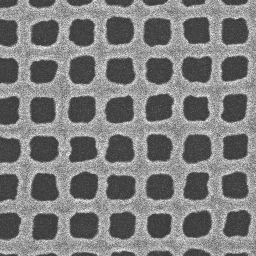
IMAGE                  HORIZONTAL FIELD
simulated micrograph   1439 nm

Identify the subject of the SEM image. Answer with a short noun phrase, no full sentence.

a regular array of holes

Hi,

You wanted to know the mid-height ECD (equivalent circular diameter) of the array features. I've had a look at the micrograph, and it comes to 158 nanometres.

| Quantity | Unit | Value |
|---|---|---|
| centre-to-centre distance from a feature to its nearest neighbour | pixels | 37.5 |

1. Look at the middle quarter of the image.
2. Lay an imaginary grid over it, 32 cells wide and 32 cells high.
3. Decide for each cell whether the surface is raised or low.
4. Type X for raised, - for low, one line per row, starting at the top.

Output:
XX------XXX------XXXX------XX---
X-------XXX-------XXX------XX---
X-------XXX-------XX-------XX---
XX-----XXXX-------XXX------XXX--
XX-----XXXXX-----XXXXX----XXXXXX
XXXXXXXXXXXXXXXXXXXXXXXXXXXXXXXX
XXXXXXXXXXXXXXXXXXXXXXXXXXXXXXXX
XXXXXXXXXXXXXXXXXXXXXXXX--XXXXXX
XX-----XXXXX-----XXXX------XXX--
X-------XXX------XXXX------XXX--
X-------XX-------XXX-------XXX--
X-------XX-------XXX-------XXX--
X-------XX-------XXX-------XXX--
X------XXX-------XXX------XXXX--
XX----XXXXX----XXXXXXXXXXXXXXXXX
XXXXXXXXXXXXXXXXXXXXXXXXXXXXXXXX
XXXXXXXXXXXXXXXXXXXXXXXXXXXXXXXX
XXXXXXXXXXXXX-XXXXXXXX--XXXXXXXX
XX-----XXXX------XXXX-----XXXXX-
X-------XXX------XXXX------XXX--
XX------XXX------XXXX------XXX--
XX------XXX------XXXX------XXX--
XX------XX--------XXX------XXX--
X-------XX-------XXXX-----XXXX--
XX---XXXXXX------XXXXXXXXXXXXXX-
XXXXXXXXXXXXXXXXXXXXXXXXXXXXXXXX
XXXXXXXXXXXXXXXXXXXXXXXXXXXXXXXX
XXXX---XXXXXXXXXXXXXXXXXXXXXXXX-
XX-------XX------XXXX------XXXX-
XX------XXX-------XXX------XXXX-
X-------XXX-------XXX------XXX--
X--------XX-------XX-------XXX--